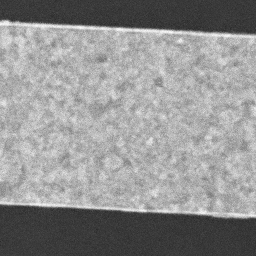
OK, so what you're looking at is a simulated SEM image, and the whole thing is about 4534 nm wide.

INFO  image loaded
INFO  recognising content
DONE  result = one or a few lines or trenches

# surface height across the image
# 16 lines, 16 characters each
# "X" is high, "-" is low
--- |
----------------
----------------
XXXXXXXXXXXXXXXX
XXXXXXXXXXXXXXXX
XXXXXXXXXXXXXXXX
XXXXXXXXXXXXXXXX
XXXXXXXXXXXXXXXX
XXXXXXXXXXXXXXXX
XXXXXXXXXXXXXXXX
XXXXXXXXXXXXXXXX
XXXXXXXXXXXXXXXX
XXXXXXXXXXXXXXXX
XXXXXXXXXXXXXXXX
----------------
----------------
----------------